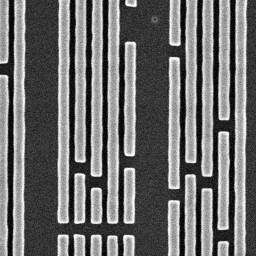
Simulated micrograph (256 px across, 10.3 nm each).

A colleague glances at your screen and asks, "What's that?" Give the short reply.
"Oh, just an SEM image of groups of lines, slits or small figures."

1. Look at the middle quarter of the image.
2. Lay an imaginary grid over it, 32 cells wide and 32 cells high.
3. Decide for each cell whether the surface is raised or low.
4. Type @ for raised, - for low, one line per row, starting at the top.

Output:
@--@@--@@--@@--@@@---------@@--@
@--@@--@@--@@--@@@--------@@@--@
@--@@--@@--@@@-@@@--------@@@--@
@--@@--@@--@@@-@@@--------@@@--@
@--@@--@@--@@@-@@@---------@@--@
@--@@--@@--@@--@@@---------@@--@
@--@@--@@--@@--@@@--------@@@--@
@--@@--@@--@@--@@@--------@@@--@
@--@@--@@--@@--@@@--------@@@--@
@--@@--@@--@@--@@@--------@@@--@
@--@@--@@--@@--@@@--------@@@--@
@--@@--@@--@@--@@@--------@@@--@
@--@@--@@--@@--@@@--------@@@--@
@--@@--@@--@@--@@@--------@@@--@
@--@@--@@--@@--@@@--------@@@-@@
@--@@--@@--@@--@@@--------@@@-@@
@--@@--@@--@@--@@@--------@@@-@@
@--@@--@@--@@--@@@--------@@@-@@
@--@@--@@--@@--@@@--------@@@-@@
@--@@--@@--@@--@@@--------@@@--@
@--@@--@@--@@--@@@--------@@@--@
@--@@--@@--@@--@@@--------@@@--@
@--@@--@@--@@--@@@--------@@@-@@
@--@@--@@--@@-------------@@@-@@
@---@--@@--@@-------------@@@--@
@------@@--@@-------------@@@---
@------@@--@@--@@@--------@@@---
@--@@--@@--@@--@@@--------@@@---
@--@@------@@--@@@--------@@@-@@
@--@@------@@--@@@--------@@@-@@
@--@@------@@--@@@--------@@@-@@
@--@@--@@--@@--@@@------------@@